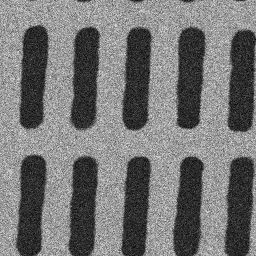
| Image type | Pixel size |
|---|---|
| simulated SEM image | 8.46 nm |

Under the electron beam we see holes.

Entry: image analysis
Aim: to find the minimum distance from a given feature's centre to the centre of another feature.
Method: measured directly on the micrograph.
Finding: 0.437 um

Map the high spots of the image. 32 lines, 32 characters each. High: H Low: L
HHHHHHHHHHHHHHHHHHHHHHHHHHHHHHHH
HHHHHHHHHHHHHHHHHHHHHHHHHHHHHHHH
HHHHHHHHHHHHHHHHHHHHHHHHHHHHHHHH
HHHHLLHHHHHLHHHHHLHHHHHLLHHHHHHH
HHHLLLHHHLLLHHHHLLLHHHLLLLHHHLLL
HHHLLLHHHLLLHHHHLLLHHHLLLLHHHLLL
HHHLLLHHHLLLHHHHLLLHHHLLLLHHHLLL
HHHLLLHHHLLLHHHHLLLHHHLLLHHHHLLL
HHHLLLHHHLLLHHHHLLLHHHLLLHHHHLLL
HHHLLLHHHLLLHHHHLLLHHHLLLHHHHLLL
HHHLLLHHHLLLHHHHLLLHHHLLLHHHHLLL
HHHLLLHHHLLLHHHHLLLHHHLLLHHHHLLL
HHHLLHHHHLLLHHHLLLLHHHLLLHHHHLLL
HHHLLLHHHLLLHHHLLLHHHHLLLHHHHLLL
HHLLLHHHHLLLHHHLLLLHHHLLLHHHHLLL
HHHLLHHHHLLLHHHHLLHHHHLLLHHHLLLL
HHHHHHHHHHHHHHHHHHHHHHHHHHHHHHHH
HHHHHHHHHHHHHHHHHHHHHHHHHHHHHHHH
HHHHHHHHHHHHHHHHHHHHHHHHHHHHHHHH
HHHLLHHHHHHHHHHHHHHHHHHHHHHHHHHH
HHHLLLHHHLLLHHHHLLLHHHHLLHHHHLLL
HHHLLLHHHLLLHHHHLLLHHHLLLHHHHLLL
HHHLLLHHHLLLHHHHLLLHHHLLLHHHHLLL
HHHLLLHHHLLLHHHHLLLHHHLLLHHHHLLL
HHHLLLHHHLLLHHHHLLLHHHLLLHHHLLLL
HHLLLHHHHLLLHHHHLLLHHHLLLHHHLLLL
HHLLLHHHHLLLHHHLLLHHHHLLLHHHLLLH
HHLLLHHHHLLLHHHLLLHHHHLLLHHHLLLH
HHLLLHHHHLLLHHHLLLHHHHLLLHHHLLLH
HHLLLHHHHLLLHHHLLLHHHHLLLHHHLLLH
HHLLLHHHHLLLHHHLLLHHHHLLLHHHLLLH
HHLLLHHHHLLLHHHLLLHHHHLLLHHHLLLH